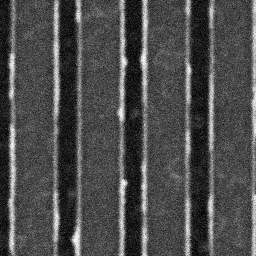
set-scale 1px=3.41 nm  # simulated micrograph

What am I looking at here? one or a few lines or trenches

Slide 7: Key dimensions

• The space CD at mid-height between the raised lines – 141 nanometres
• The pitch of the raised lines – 225 nm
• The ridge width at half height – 0.0864 µm